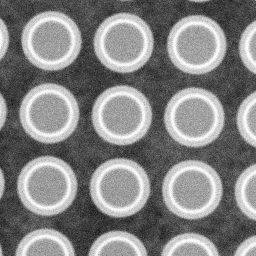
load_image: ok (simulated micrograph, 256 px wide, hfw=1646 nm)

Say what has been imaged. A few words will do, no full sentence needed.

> an array of small figures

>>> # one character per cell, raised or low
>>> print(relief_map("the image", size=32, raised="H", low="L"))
LLLLLLLLLLLLLLLLLLLLLLLLLLLLLLLL
LLLLLLHLLLLLLLLLLLLLLLLLLLLLLLLL
LLLLHHHHHLLLLHHHHHLLLLLHHHHLLLLL
HLLHHHHHHHLLHHHHHHHLLLHHHHHHLLLH
HLLHHHHHHHLLHHHHHHHLLHHHHHHHLLHH
HLLHHHHHHHLLHHHHHHHLLHHHHHHHLLHH
HLLHHHHHHHLLHHHHHHHLLHHHHHHHLLHH
LLLLHHHHHLLLHHHHHHLLLHHHHHHHLLHH
LLLLLHHHLLLLLLHHHLLLLLHHHHHLLLLH
LLLLLLLLLLLLLLLLLLLLLLLLLLLLLLLL
LLLLLLHLLLLLLLLLLLLLLLLLLLLLLLLL
LLLLHHHHHLLLLHHHHLLLLLHHHHLLLLLL
LLLHHHHHHLLLHHHHHHLLLHHHHHHLLLLH
HLLHHHHHHHLLHHHHHHHLLHHHHHHHLLHH
HLHHHHHHHHLLHHHHHHHLLHHHHHHHLLHH
LLLHHHHHHHLLHHHHHHHLLHHHHHHHLLHH
LLLHHHHHHLLLHHHHHHLLLHHHHHHHLLHH
LLLLLHHHLLLLLHHHHLLLLLHHHHHLLLLH
LLLLLLLLLLLLLLLLLLLLLLLLLLLLLLLL
LLLLLLLLLLLLLLLLLLLLLLLLLLLLLLLL
LLLHHHHHLLLLLHHHHLLLLLHHHHLLLLLL
LLLHHHHHHLLLHHHHHHLLLHHHHHHLLLHH
HLHHHHHHHHLHHHHHHHHLLHHHHHHHLLHH
LLHHHHHHHHLHHHHHHHHLHHHHHHHHLHHH
LLHHHHHHHLLHHHHHHHHLHHHHHHHHLHHH
LLLHHHHHHLLLHHHHHHLLLHHHHHHLLLHH
LLLLHHHHLLLLLHHHHLLLLLHHHHLLLLHH
LLLLLLLLLLLLLLLLLLLLLLLLLLLLLLLL
LLLLLLLLLLLLLLLLLLLLLLLLLLLLLLLL
LLLHHHHHLLLLLHHHHLLLLLHHHLLLLLLL
LLHHHHHHHLLLHHHHHHLLLHHHHHHLLLHH
LLHHHHHHHLLHHHHHHHLLHHHHHHHLLHHH